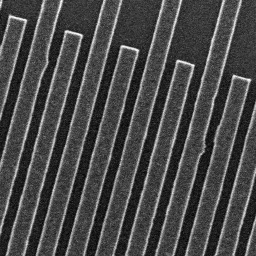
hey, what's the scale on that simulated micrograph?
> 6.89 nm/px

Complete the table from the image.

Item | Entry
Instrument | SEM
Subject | parallel lines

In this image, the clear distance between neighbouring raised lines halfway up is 81.6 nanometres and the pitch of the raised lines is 0.199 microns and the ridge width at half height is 122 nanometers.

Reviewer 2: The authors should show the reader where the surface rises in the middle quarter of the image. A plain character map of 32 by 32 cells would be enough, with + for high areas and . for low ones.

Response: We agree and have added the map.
+++...++++...+++++...++++...++++
++...+++++...++++...+++++...++++
++...++++....++++...++++...+++++
++...++++...+++++...++++...+++++
++...++++...++++...+++++...++++.
+...+++++...++++...+++++...++++.
+...++++....++++...++++...+++++.
+...++++...+++++...++++...+++++.
....++++...+++++..+++++...++++..
...+++++...++++...++++....++++..
...++++...+++++...++++...+++++..
...++++...+++++...++++...+++++..
...++++...++++...+++++...++++...
..+++++...++++...+++++..+++++...
..++++...+++++...++++...+++++...
..++++...+++++...++++...+++++...
.+++++...++++...+++++...++++...+
.+++++...++++...+++++..+++++...+
.++++...+++++...++++...+++++...+
.++++...+++++..+++++...++++....+
+++++...++++...+++++...++++...++
++++....++++...+++++..+++++...++
++++...+++++...++++...+++++...++
++++...+++++..+++++...++++...+++
++++...++++...+++++...++++...+++
+++...+++++...++++...+++++...+++
+++...+++++...++++...+++++...+++
+++...++++...+++++...++++...++++
+++...++++...++++....++++...++++
++...+++++...++++...+++++...++++
++...++++....++++...+++++..+++++
++...++++...+++++...++++...+++++